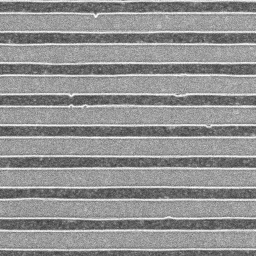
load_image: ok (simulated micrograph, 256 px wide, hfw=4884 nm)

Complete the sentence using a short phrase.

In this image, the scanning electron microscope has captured parallel lines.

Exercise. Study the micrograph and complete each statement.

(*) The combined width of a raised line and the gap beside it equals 593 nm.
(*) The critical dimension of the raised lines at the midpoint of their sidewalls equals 227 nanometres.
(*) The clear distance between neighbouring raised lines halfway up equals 361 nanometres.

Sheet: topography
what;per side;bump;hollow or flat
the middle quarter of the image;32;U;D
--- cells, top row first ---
UUUUUUUUUUUUUUUUUUUUUUUUUUUUUUUU
UUUUUUUUUUUUUUUUUUUUUUUUUUUUUUUU
UUUUUUUUUUUUUUUUUUUUUUUUUUUUUUUU
DDDDDDDDDDDDDDDDDDDDDDDDDDDDDDDD
DDDDDDDDDDDDDDDDDDDDDDDDDDDDDDDD
DDDDDDDDDDDDDDDDDDDDDDDDDDDDDDDD
DDDDDDDDDDDDDDDDDDDDDDDDDDDDDDDD
DDDDDDDDDDDDDDDDDDDDDDDDDDDDDDDD
UUUUUUUUUUUUUUUUUUUUUUUUUUUUUUUU
UUUUUUUUUUUUUUUUUUUUUUUUUUUUUUUU
UUUUUDUUUUDDDDDDDUUUUUUUUUUUUUUU
DDDDDDDDDDDDDDDDDDDDDDDDDDDDDDDD
DDDDDDDDDDDDDDDDDDDDDDDDDDDDDDDD
DDDDDDDDDDDDDDDDDDDDDDDDDDDDDDDD
DDDDDDDDDDDDDDDDDDDDDDDDDDDDDDDD
UUUUUUUUUUUUUUUUUUUUUUUUUUUUUUUU
UUUUUUUUUUUUUUUUUUUUUUUUUUUUUUUU
UUUUUUUUUUUUUUUUUUUUUUUUUUUUUUUU
DDDDDDDDDDDDDDDDDDDDDDDDDDDDDDDD
DDDDDDDDDDDDDDDDDDDDDDDDDDDDDDDD
DDDDDDDDDDDDDDDDDDDDDDDDDDDDDDDD
DDDDDDDDDDDDDDDDDDDDDDDDDDDDDDDD
DDDDDDDDDDDDDDDDDDDDDDDDDDDDDDDD
UUUUUUUUUUUUUUUUUUUUUUUUUUUUUUUU
UUUUUUUUUUUUUUUUUUUUUUUUUUUUUUUU
UUUUUUUUUUUUUUUUUUUUUUUUUUUUUUUU
DDDDDDDDDDDDDDDDDDDDDDDDDDDDDDDD
DDDDDDDDDDDDDDDDDDDDDDDDDDDDDDDD
DDDDDDDDDDDDDDDDDDDDDDDDDDDDDDDD
DDDDDDDDDDDDDDDDDDDDDDDDDDDDDDDD
DDDDDDDDDDDDDDDDDDDDDDDDDDDDDDDD
UUUUUUUUUUUUUUUUUUUUUUUUUUUUUUUU